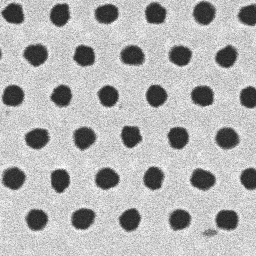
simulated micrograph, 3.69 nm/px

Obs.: a regular array of holes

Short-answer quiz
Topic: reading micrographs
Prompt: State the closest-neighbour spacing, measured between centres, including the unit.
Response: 171 nm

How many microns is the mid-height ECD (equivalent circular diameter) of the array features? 0.0793